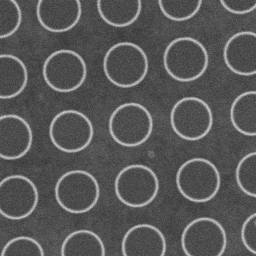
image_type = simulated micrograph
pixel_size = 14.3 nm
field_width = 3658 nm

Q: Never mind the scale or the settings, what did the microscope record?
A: an array of small figures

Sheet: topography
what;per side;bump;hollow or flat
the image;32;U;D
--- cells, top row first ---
UUDDDUUUUUDDUUUUUUDDUUUUUDDDUUUU
UUUDDUUUUUDDUUUUUDDDUUUUUDDDDUUD
UUUDDUUUUUDDDUUUUDDDDDUDDDDDDDDD
UUDDDDUUUDDDDDDDDDDDDDDDDDDDDDDD
UDDDDDDDDDDDDDDDDDDDDDDDDDDDDUUU
DDDDDDDDDDDDDDDUDDDDDUUUUDDDUUUU
DDDDDDDUUDDDDUUUUUDDDUUUUUDDUUUU
UUDDDDUUUUDDDUUUUUDDDUUUUUDDUUUU
UUUDDUUUUUUDDUUUUUDDDUUUUUDDDUUU
UUUDDUUUUUUDDUUUUUDDDUUUUDDDDDDD
UUUDDDUUUUDDDDUUUDDDDDDDDDDDDDDD
UUUDDDDDDDDDDDDDDDDDDDDDDDDDDDDU
DDDDDDDDDDDDDDDDDDDDDDDUUDDDDUUU
DDDDDDDDDDDDDDDUUUDDDDUUUUDDDUUU
DUDDDDDUUUUDDDUUUUUDDUUUUUDDDUUU
UUUDDDUUUUUDDDUUUUUDDUUUUUDDDUUU
UUUUDDUUUUUUDDUUUUUDDDUUUUDDDDUU
UUUUDDUUUUUDDDUUUUDDDDDDDDDDDDDD
UUUUDDDUUUDDDDDDDDDDDDDDDDDDDDDD
UUUDDDDDDDDDDDDDDDDDDDDDDDDDDDDU
DDDDDDDDDDDDDDDDDDDDDDDUUUDDDDUU
DDDDDDDDDUUDDDDUUUUDDDUUUUUDDDUU
UUUUDDDUUUUUDDDUUUUUDDUUUUUDDDUU
UUUUDDDUUUUUDDUUUUUUDDUUUUUDDDUU
UUUUUDDUUUUUDDDUUUUDDDDUUUUDDDDD
UUUUUDDUUUUUDDDDUUDDDDDDDDDDDDDD
UUUUDDDDDUDDDDDDDDDDDDDDDDDDDDDD
DDDDDDDDDDDDDDDDDDDDDDDDUUUDDDDU
DDDDDDDDDDDDDDDDDUUDDDDUUUUUDDUU
DDDDDDDDDUUUDDDDUUUUDDDUUUUUDDUU
DUUUUDDDUUUUUDDUUUUUUDDUUUUUDDDU
UUUUUDDDUUUUUDDUUUUUUDDUUUUUDDDD